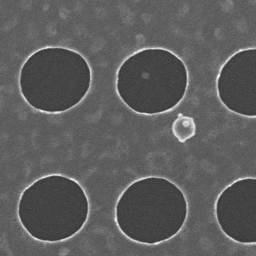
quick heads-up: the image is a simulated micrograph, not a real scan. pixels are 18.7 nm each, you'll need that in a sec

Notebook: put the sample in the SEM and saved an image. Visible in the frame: holes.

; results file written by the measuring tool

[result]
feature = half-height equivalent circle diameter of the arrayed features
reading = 1.27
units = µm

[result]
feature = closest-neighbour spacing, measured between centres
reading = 1830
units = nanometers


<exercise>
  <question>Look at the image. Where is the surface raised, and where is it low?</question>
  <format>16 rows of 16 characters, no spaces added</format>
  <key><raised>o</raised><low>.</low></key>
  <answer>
oooooooooooooooo
oooooooooooooooo
oooooooooooooooo
oo...ooo...oooo.
o.....o.....oo..
o....oo.....oo..
oo...ooo...ooo..
oooooooooooooooo
oooooooooooooooo
oooooooooooooooo
oooooooooooooooo
oo...ooo...oooo.
o....oo.....oo..
o....oo.....oo..
oo...ooo...ooo..
oooooooooooooooo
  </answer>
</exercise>